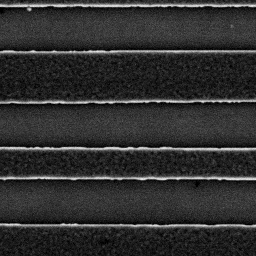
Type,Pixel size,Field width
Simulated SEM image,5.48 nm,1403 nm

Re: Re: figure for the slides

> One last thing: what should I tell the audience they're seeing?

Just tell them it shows lines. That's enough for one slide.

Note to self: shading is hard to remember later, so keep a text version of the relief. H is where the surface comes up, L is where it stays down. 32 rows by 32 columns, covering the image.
HHHHHHHHHHHHHHHHHHHHHHHHHHHHHHHH
LLLLLLLLLLLLLLLLLLLLLLLLLLLLLLLL
LLLLLLLLLLLLLLLLLLLLLLLLLLLLLLLL
LLLLLLLLLLLLLLLLLLLLLLLLLLLLLLLL
LLLLLLLLLLLLLLLLLLLLLLLLLLLLLLLL
LLLLLLLLLLLLLLLLLLLLLLLLLLLLLLLL
HHLHHLHLLHLHHHHHHHHHHHHHHHHHHHHH
HHHHHHHHHHHHHHHHHHHHHHHHHHHHHHHH
HHHHHHHHHHHHHHHHHHHHHHHHHHHHHHHH
HHHHHHHHHHHHHHHHHHHHHHHHHHHHHHHH
HHHHHHHHHHHHHHHHHHHHHHHHHHHHHHHH
HHHHHHHHHHHHHHHHHHHHHHHHHHHHHHHH
HHHHHHHHHHHHHHHHHHHHHHHHHHHHHHHH
LLLLLLLLLLLLLLLLLLLLLLLLLLLLLLLL
LLLLLLLLLLLLLLLLLLLLLLLLLLLLLLLL
LLLLLLLLLLLLLLLLLLLLLLLLLLLLLLLL
LLLLLLLLLLLLLLLLLLLLLLLLLLLLLLLL
LLLLLLLLLLLLLLLLLLLLLLLLLLLLLLLL
HHHHHLLLHHLLLHHLLLLLHLLLLLLLLLLL
HHHHHHHHHHHHHHHHHHHHHHHHHHHHHHHH
HHHHHHHHHHHHHHHHHHHHHHHHHHHHHHHH
HHHHHHHHHHHHHHHHHHHHHHHHHHHHHHHH
LLLLLLLLLLLLLLLLLLLLLLLLLLLLLLLL
LLLLLLLLLLLLLLLLLLLLLLLLLLLLLLLL
LLLLLLLLLLLLLLLLLLLLLLLLLLLLLLLL
LLLLLLLLLLLLLLLLLLLLLLLLLLLLLLLL
LLLLLLLLLLLLLLLLLLLLLLLLLLLLLLLL
LLLLLLLLLLLLLLLLLLLLLLLLLLLLLLLL
HHHHHHHHHHHHHHHHHHHHHHHHHHHHHHHH
HHHHHHHHHHHHHHHHHHHHHHHHHHHHHHHH
HHHHHHHHHHHHHHHHHHHHHHHHHHHHHHHH
HHHHHHHHHHHHHHHHHHHHHHHHHHHHHHHH